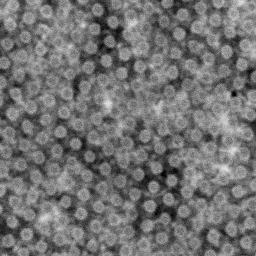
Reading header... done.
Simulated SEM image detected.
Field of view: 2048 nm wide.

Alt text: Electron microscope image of a regular array of raised bodies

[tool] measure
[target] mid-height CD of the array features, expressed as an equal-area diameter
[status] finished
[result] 87.1 nm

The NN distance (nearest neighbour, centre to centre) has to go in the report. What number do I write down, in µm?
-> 0.153